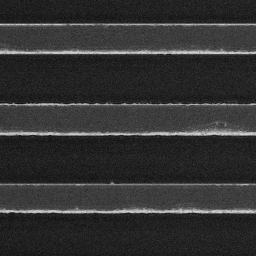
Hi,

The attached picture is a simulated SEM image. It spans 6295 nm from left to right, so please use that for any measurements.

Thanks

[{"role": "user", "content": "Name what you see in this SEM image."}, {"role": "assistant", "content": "lines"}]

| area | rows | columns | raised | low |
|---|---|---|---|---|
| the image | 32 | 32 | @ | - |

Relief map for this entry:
--------------------------------
--------------------------------
--------------------------------
@@@@@@@@@@@@@@@@@@@@@@@@@@@@@@@@
@@@@@@@@@@@@@@@@@@@@@@@@@@@@@@@@
@@@@@@@@@@@@@@@@@@@@@@@@@@@@@@@@
@@@@@@@@@@@@@@@@@@@@@@@@@@@@@@@@
--------------------------------
--------------------------------
--------------------------------
--------------------------------
--------------------------------
--------------------------------
@@@@@@@@@@@@@@@@@@@@@@@@@@@@@@@@
@@@@@@@@@@@@@@@@@@@@@@@@@@@@@@@@
@@@@@@@@@@@@@@@@@@@@@@@@@@@@@@@@
@@@@@@@@@@@@@@@@@@@@@@@@@@@@@@@@
--------------------------------
--------------------------------
--------------------------------
--------------------------------
--------------------------------
--------------------------------
@@@@@@@@@@@@@@@@@@@@@@@@@@@@@@@@
@@@@@@@@@@@@@@@@@@@@@@@@@@@@@@@@
@@@@@@@@@@@@@@@@@@@@@@@@@@@@@@@@
---@@@@@@@@@@@@@@@@@@@@@@@@@@@@@
--------------------------------
--------------------------------
--------------------------------
--------------------------------
--------------------------------